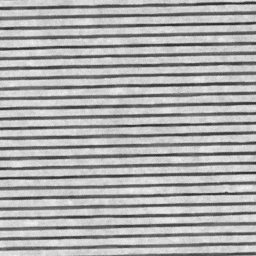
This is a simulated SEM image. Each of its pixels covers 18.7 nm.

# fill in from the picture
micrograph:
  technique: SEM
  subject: parallel lines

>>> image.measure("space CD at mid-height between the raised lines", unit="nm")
72.4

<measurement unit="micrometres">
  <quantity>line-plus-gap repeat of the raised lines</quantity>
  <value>0.187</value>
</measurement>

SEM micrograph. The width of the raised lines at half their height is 124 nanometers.